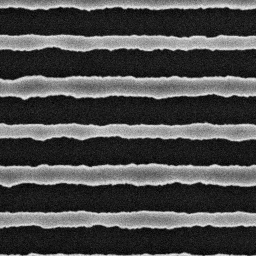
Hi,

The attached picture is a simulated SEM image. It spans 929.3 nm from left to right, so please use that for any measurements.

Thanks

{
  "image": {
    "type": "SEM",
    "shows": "lines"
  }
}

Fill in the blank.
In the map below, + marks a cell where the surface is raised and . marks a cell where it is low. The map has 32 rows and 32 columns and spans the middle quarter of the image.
................................
................................
................................
.+++++++++++++++++.......++++...
++++++++++++++++++++++++++++++++
++++++++++++++++++++++++++++++++
++++++++++++++++++++++++++++++++
++++++++++++++++++++++++++++++++
.......................+........
................................
................................
................................
................................
................................
................................
+++++.++..++++++++++++++++..++++
++++++++++++++++++++++++++++++++
++++++++++++++++++++++++++++++++
...+++...................+.+...+
................................
................................
................................
................................
................................
................................
+...+....++++++++++++++++++....+
++++++++++++++++++++++++++++++++
++++++++++++++++++++++++++++++++
++++++++++++++++++++++++++++++++
+++++++++++++++++++++++++++..+++
................................
................................